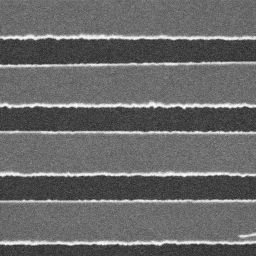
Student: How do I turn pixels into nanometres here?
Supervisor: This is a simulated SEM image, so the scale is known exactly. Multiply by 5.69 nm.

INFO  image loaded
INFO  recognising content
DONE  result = lines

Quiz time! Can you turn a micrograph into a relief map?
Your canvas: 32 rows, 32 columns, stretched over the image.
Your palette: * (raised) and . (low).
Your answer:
********************************
********************************
********************************
********************************
********************************
................................
................................
................................
********************************
********************************
********************************
********************************
********************************
................................
................................
................................
********************************
********************************
********************************
********************************
********************************
********************************
................................
................................
................................
********************************
********************************
********************************
********************************
********************************
**..*...*......**..*............
................................